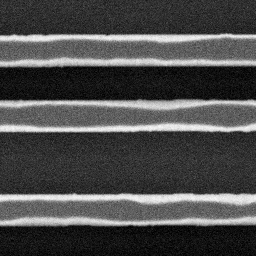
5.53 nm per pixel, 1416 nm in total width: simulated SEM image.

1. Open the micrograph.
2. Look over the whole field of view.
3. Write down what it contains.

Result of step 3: lines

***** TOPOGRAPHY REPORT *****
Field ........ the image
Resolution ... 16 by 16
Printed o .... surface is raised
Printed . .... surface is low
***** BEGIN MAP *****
................
................
oooooooooooooooo
oooooooooooooooo
................
................
oooooooooooooooo
oooooooooooooooo
................
................
................
................
oooooooooooooooo
oooooooooooooooo
................
................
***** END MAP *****